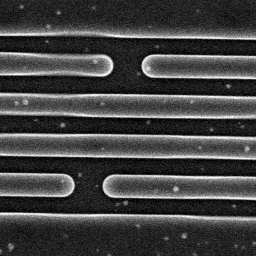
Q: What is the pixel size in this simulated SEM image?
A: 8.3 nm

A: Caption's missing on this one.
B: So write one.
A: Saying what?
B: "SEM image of groups of lines, slits or small figures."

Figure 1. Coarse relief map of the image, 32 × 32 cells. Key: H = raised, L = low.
HHHHHHHHHHHHHHHHHHHHHHHHHHHHHHHH
HHHHHHHHHHHHHHHHHHHHHHHHHHHHHHHH
HHHHHHHHHHHHHHHHHHHHHHHHHHHHHHHH
HHHHHHHHHHHHHHHHHHHHHHHHHHHHHHHH
LLLLLLLLLLLLLLLHHHHHHHHHHHHHHHHH
LLLLLLLLLLLLLLLLLLLLLLLLLLLLLLLL
LLLLLLLLLLLLLLLLLLLLLLLLLLLLLLLL
HHHHHHHHHHHHHHLLLLHHHHHHHHHHHHHH
HHHHHHHHHHHHHHLLLLHHHHHHHHHHHHHH
LLLLLLLLLLLLLLLLLLLHHHHHHHHHHHHH
LLLLLLLLLLLLLLLLLLLLLLLLLLLLLLLL
LLLLLLLLLLLLLLLLLLLLLLLLLLLLLLLL
HHHHHHHHHHHHHHHHHHHHHHHHHHHHHHHH
HHHHHHHHHHHHHHHHHHHHHHHHHHHHHHHH
LLLLLLLLLLLLHHHHHHHHHHHHHHHHHHHH
LLLLLLLLLLLLLLLLLLLLLLLLLLLLLLLL
LLLLLLLLLLLLLLLLLLLLLLLLLLLLLLLL
HHHHHHHHHHHHHHHHHHHHHHHHHHHHHHHH
HHHHHHHHHHHHHHHHHHHHHHHHHHHHHHHH
LLLLLLLLLHHHHHHHHHHHHHHHHHHHHHHH
LLLLLLLLLLLLLLLLLLLLLLLLLLLLLLLL
LLLLLLLLLLLLLLLLLLLLLLLLLLLLLLLL
HHHHHHHHHLLLLHHHHHHHHHHHHHHHHHHH
HHHHHHHHHLLLLHHHHHHHHHHHHHHHHHHH
LLLLLLLHLLLLLLHHHHHHHHHHHHHHHHHH
LLLLLLLLLLLLLLLLLLLLLLLLLLLLLLLL
LLLLLLLLLLLLLLLLLLLLLLLLLLLLLLLL
HHHHHHHHHHHHHHHHHHHHHHHHHHHHHHHH
HHHHHHHHHHHHHHHHHHHHHHHHHHHHHHHH
HHHHHHHHHHHHHHHHHHHHHHHHHHHHHHHH
HHHHHHHHHHHHHHHHHHHHHHHHHHHHHHHH
HHHHHHHHHHHHHHHHHHHHHHHHHHHHHHHH